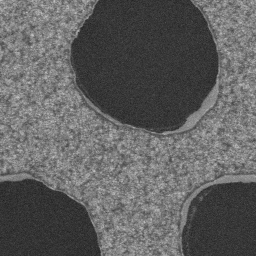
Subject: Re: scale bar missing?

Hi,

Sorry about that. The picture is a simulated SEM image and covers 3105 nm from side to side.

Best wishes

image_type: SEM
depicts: holes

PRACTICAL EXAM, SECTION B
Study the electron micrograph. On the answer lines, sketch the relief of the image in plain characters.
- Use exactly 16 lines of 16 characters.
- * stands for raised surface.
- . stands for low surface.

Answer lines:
******......****
*****........***
*****........***
****..........**
*****.........**
*****........***
******.......***
*******.....****
****************
****************
****************
...**********...
.....*******....
......*****.....
......*****.....
......*****.....